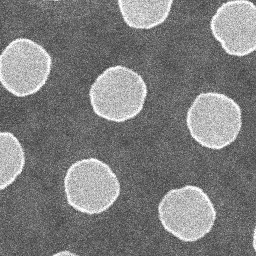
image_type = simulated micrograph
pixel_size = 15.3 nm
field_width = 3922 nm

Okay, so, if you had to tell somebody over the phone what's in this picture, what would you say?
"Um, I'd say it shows raised bodies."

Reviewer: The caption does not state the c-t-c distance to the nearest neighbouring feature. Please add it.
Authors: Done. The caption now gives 1480 nm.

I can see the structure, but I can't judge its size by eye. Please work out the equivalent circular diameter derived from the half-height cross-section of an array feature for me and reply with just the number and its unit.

819 nm